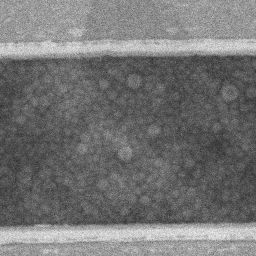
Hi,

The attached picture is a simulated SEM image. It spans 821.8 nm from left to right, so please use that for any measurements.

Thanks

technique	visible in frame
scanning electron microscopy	one or a few lines or trenches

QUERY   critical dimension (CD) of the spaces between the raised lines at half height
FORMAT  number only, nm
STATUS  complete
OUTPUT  601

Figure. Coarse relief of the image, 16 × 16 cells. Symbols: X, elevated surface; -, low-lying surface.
XXXXXXXXXXXXXXXX
XXXXXXXXXXXXXXXX
XXXXXXXXXXXXXXXX
----------------
----------------
----------------
----------------
----------------
----------------
----------------
----------------
----------------
----------------
----------------
----------------
XXXXXXXXXXXXXXXX